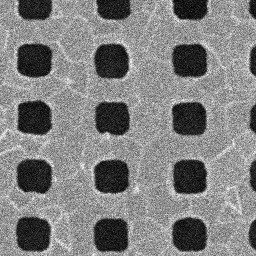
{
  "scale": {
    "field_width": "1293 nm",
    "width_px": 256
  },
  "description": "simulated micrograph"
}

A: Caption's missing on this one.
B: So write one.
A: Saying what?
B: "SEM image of a regular array of holes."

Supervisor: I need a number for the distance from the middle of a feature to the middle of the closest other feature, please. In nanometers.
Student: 293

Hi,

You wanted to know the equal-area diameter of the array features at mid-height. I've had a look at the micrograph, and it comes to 184 nanometers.